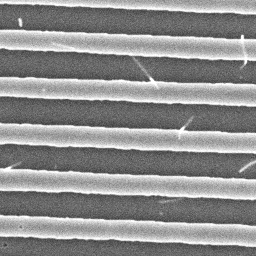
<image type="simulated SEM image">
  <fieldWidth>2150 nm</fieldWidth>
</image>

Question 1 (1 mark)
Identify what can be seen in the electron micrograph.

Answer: lines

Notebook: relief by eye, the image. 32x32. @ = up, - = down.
----@@@@@@@@@@@@@@@@@@@@@@@@@@@@
---------------------------@-@@@
--------------------------------
--------------------------------
@@@@@@@@@@@@@@@@@@@-------------
@@@@@@@@@@@@@@@@@@@@@@@@@@@@@@@@
-----------@@@@@@@@@@@@@@@@@@@@@
------------------------------@@
--------------------------------
--------------------------------
@@@@@@@@@@@@@@@@@@@@@@@@@@@@@---
@@@@@@@@@@@@@@@@@@@@@@@@@@@@@@@@
--------------@@@@@@@@@@@@@@@@@@
--------------------------------
--------------------------------
@-------------------------------
@@@@@@@@@@@@@@@@@@@@@@@@--------
@@@@@@@@@@@@@@@@@@@@@@@@@@@@@@@@
---------------@@@@@@@@@@@@@@@@@
--------------------------------
--------------------------------
@@@@@@@@@@----------------------
@@@@@@@@@@@@@@@@@@@@@@@@@@@@@@@-
@@@@@@@@@@@@@@@@@@@@@@@@@@@@@@@@
---------------------@@@@@@@@@@@
--------------------------------
--------------------------------
@@@@@@@@@@@@@-------------------
@@@@@@@@@@@@@@@@@@@@@@@@@@@@@@@@
---@@@@@@@@@@@@@@@@@@@@@@@@@@@@@
-------------------------@@@@@@@
--------------------------------